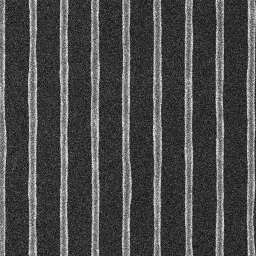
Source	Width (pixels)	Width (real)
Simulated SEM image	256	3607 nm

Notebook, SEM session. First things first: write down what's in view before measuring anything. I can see parallel lines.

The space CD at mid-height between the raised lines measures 338 nm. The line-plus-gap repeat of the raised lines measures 0.44 µm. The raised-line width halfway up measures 100 nanometers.